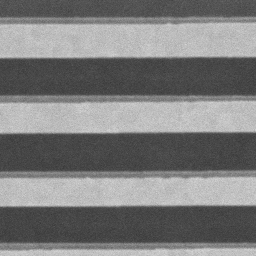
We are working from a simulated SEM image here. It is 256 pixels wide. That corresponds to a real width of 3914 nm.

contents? lines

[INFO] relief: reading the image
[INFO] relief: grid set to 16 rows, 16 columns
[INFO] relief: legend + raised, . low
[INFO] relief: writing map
................
++++++++++++++++
++++++++++++++++
++++++++++++++++
................
................
++++++++++++++++
++++++++++++++++
................
................
................
++++++++++++++++
++++++++++++++++
................
................
++++++++++++++++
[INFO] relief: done